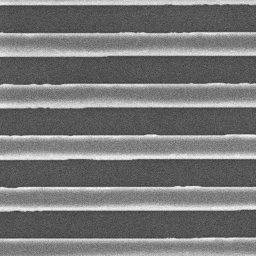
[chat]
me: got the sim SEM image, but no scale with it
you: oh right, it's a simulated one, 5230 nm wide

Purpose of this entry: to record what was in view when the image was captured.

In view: lines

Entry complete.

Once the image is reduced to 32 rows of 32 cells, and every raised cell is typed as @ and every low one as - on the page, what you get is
@@@@@@@@@-----------------------
--------------------------------
--------------------------------
--------------------------------
@@@@@@@@@@@@@@@@@@@@@@@@@@@@@@@@
@@@@@@@@@@@@@@@@@@@@@@@@@@@@@@@@
@@@@@@@@@@@@@@@@@@@@@@@@@@@@@@@@
--------------------------------
--------------------------------
--------------------------------
--------------------------@@@-@-
@@@@@@@@@@@@@@@@@@@@@@@@@@@@@@@@
@@@@@@@@@@@@@@@@@@@@@@@@@@@@@@@@
--------------------------------
--------------------------------
--------------------------------
--------------------------------
@@@@@@@@@@@@@@@@@@@@@@@@@@@@@@@@
@@@@@@@@@@@@@@@@@@@@@@@@@@@@@@@@
@@@@@@@@@@@@@@@@@@@@@@@@@@@@@@@@
--------------------------------
--------------------------------
--------------------------------
@-@@@@@@@@@@@@@@@@@@@@@@@@@@@@@@
@@@@@@@@@@@@@@@@@@@@@@@@@@@@@@@@
@@@@@@@@@@@@@@@@@@@@@@@@@@@@@@@@
--------------------------------
--------------------------------
--------------------------------
--------------------------------
@@@@@@@@@@@@@@@@@@@@@@@@@@@@@@@@
@@@@@@@@@@@@@@@@@@@@@@@@@@@@@@@@